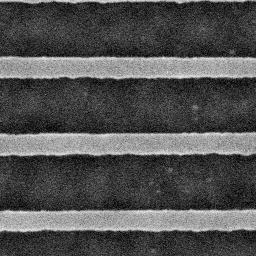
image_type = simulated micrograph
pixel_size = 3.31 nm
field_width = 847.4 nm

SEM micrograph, lines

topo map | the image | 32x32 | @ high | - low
--------------------------------
--------------------------------
--------------------------------
--------------------------------
--------------------------------
--------------------------------
--------------------------------
@@@@@@@@@@@@@@@@@@@@@@@@@@@@@@@@
@@@@@@@@@@@@@@@@@@@@@@@@@@@@@@@@
@@@@@@@@@@@@@@@@@@@@@@@@@@@@@@@@
--------------------------------
--------------------------------
--------------------------------
--------------------------------
--------------------------------
--------------------------------
--------------------------------
@@@@@@@@@@@@@@@@@@@@@@@@@@@@@@@@
@@@@@@@@@@@@@@@@@@@@@@@@@@@@@@@@
--------------------------------
--------------------------------
--------------------------------
--------------------------------
--------------------------------
--------------------------------
--------------------------------
@@@--@--@@@@@@@@@@@@@@@@@@@@@@@@
@@@@@@@@@@@@@@@@@@@@@@@@@@@@@@@@
@@@@@@@@@@@@@@@@@@@@@@@@@@@@@@@@
--------------------------------
--------------------------------
--------------------------------